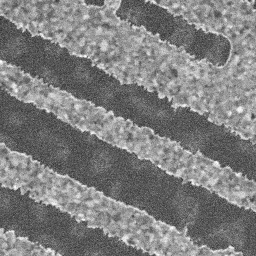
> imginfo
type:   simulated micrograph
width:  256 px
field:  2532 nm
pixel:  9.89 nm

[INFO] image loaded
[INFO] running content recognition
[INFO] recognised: one or a few lines or trenches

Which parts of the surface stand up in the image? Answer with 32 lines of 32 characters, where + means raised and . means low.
+++++++++++..++....+++++++++++++
++++++++++++++.......+++++++++++
.++++++++++++++........+++++++++
...+++++++++++++++.......+++++++
.....+++++++++++++++........++++
.......++++++++++++++........+++
.........++++++++++++++......+++
...........++++++++++++++....+++
++...........+++++++++++++++++++
++++..........++++++++++++++++++
++++++...........+++++++++++++++
.+++++++............++++++++++++
...+++++++...........+++++++++++
.....++++++++...........++++++++
.......+++++++............++++++
.........++++++++..........+++++
...........++++++++..........+++
.............++++++++..........+
+..............++++++++.........
++++.............++++++++.......
+++++..............++++++++.....
+++++++..............++++++++...
+++++++++..............++++++++.
.++++++++++...............++++++
....+++++++++...............++++
.......++++++++..............+++
........++++++++++..............
..........+++++++++.............
.............+++++++++..........
++.............++++++++.........
++++............++++++++........
+++++++...........++++++++++++..